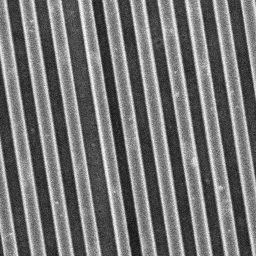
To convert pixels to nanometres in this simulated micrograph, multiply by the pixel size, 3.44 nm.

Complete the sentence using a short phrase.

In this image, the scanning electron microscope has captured parallel lines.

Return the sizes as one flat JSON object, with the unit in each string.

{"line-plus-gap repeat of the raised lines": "93.9 nm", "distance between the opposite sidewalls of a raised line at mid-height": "45.9 nm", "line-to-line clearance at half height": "45.9 nm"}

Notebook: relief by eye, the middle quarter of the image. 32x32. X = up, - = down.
XX----XXX---XXXX---XXXX---XXX---
XX----XXXX---XXX----XXX---XXXX--
XX-----XXX---XXX----XXX---XXXX--
XX-----XXX---XXX----XXX----XXX--
XX-----XXX---XXX----XXX----XXX--
XX-----XXX---XXX----XXX----XXX--
XXX----XXX---XXXX---XXXX---XXXX-
XXX----XXX----XXX---XXXX---XXXX-
XXX-----XXX---XXX---XXXX---XXXX-
XXX-----XXX---XXX----XXX----XXX-
XXX-----XXX---XXX----XXX----XXX-
XXX-----XXX---XXX----XXX----XXX-
XXXX----XXX---XXXX---XXX----XXX-
XXXX----XXX---XXXX---XXXX---XXX-
-XXX-----XXX---XXX---XXXX---XXXX
-XXX-----XXX---XXX----XXX---XXXX
-XXX-----XXX---XXX----XXX----XXX
-XXX-----XXX---XXX----XXX----XXX
-XXXX----XXX---XXX----XXX----XXX
-XXXX----XXX---XXXX---XXXX---XXX
--XXX----XXX----XXX---XXXX---XXX
--XXX-----XXX---XXX---XXXX---XXX
--XXX-----XXX---XXX----XXX----XX
--XXX-----XXX---XXX----XXX----XX
--XXX-----XXX---XXX----XXX----XX
--XXXX----XXX---XXXX---XXXX---XX
---XXX----XXX---XXXX---XXXX---XX
---XXX-----XXX---XXX---XXXX---XX
---XXX-----XXX---XXX----XXX----X
---XXX-----XXX---XXX----XXX----X
---XXX-----XXX---XXX----XXX----X
---XXXX----XXX---XXX----XXX----X